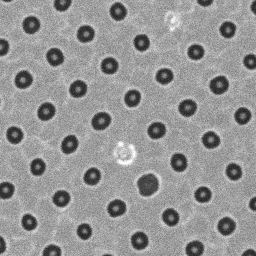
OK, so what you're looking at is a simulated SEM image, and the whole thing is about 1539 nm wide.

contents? a regular array of ring-shaped grooves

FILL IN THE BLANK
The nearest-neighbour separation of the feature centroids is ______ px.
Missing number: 38.9